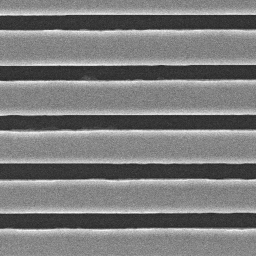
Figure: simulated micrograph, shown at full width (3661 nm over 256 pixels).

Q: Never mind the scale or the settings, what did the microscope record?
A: lines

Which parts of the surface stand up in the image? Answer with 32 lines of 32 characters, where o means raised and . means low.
oooooooooooooooooooooooooooooooo
oooooooooooooooooooooooooooooooo
................................
................................
oooooooooooooooooooooooooooooooo
oooooooooooooooooooooooooooooooo
oooooooooooooooooooooooooooooooo
oooooooooooooooooooooooooooooooo
................................
................................
oooooooooooooooooooooooooooooooo
oooooooooooooooooooooooooooooooo
oooooooooooooooooooooooooooooooo
oooooooooooooooooooooooooooooooo
................................
................................
oooooooooooooooooooooooooooooooo
oooooooooooooooooooooooooooooooo
oooooooooooooooooooooooooooooooo
oooooooooooooooooooooooooooooooo
................................
................................
.......ooooooo.ooooooooooooooooo
oooooooooooooooooooooooooooooooo
oooooooooooooooooooooooooooooooo
oooooooooooooooooooooooooooooooo
oooooooooooooooooooooooooooooooo
................................
................................
oooooooooooooooooooooooooooooooo
oooooooooooooooooooooooooooooooo
oooooooooooooooooooooooooooooooo